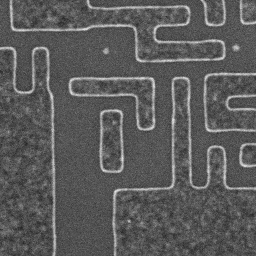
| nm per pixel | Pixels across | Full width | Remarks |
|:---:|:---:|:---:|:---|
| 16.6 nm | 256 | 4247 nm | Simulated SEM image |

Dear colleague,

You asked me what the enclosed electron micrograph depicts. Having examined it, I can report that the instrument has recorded wiring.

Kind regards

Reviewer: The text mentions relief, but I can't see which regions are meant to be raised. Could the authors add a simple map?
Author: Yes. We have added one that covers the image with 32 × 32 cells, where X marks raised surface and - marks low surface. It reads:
-XXXXXXXXXX---------------XX--XX
-XXXXXXXXXXXXXXXXXXXXXXX--XX--XX
-XXXXXXXXXXXXXXXXXXXXXXX--XX--XX
--XXXXXXXXX------XXX------------
-----------------XX-------------
-----------------XXXXXXXXXXX----
XX--XX-----------XXXXXXXXXXX----
XX--XX-----------XXXXXXX--------
XX--XX--------------------------
XX--XX--------------------XXXXXX
XX--XX---XXXXXXXXXX---XX--XXXXXX
XXXXXX---XXXXXXXXXX---XX--XXXXXX
XXXXXXX----------XX---XX--XXX---
XXXXXXX----------XX---XX--XXX---
XXXXXXX------XX--XX---XX--XXXXXX
XXXXXXX------XX--XX---XX--XXXXXX
XXXXXXX------XX-------XX--------
XXXXXXX------XX-------XX--------
XXXXXXX------XX-------XX--XX--XX
XXXXXXX------XX-------XX--XX--XX
XXXXXXX------XX-------XX--XX--XX
XXXXXXX---------------XX--XX----
XXXXXXX---------------XX--XX----
XXXXXXX--------------XXXXXXXX---
XXXXXXX-------XXXXXXXXXXXXXXXXXX
XXXXXXX-------XXXXXXXXXXXXXXXXXX
XXXXXXX-------XXXXXXXXXXXXXXXXXX
XXXXXXX-------XXXXXXXXXXXXXXXXXX
XXXXXXX-------XXXXXXXXXXXXXXXXXX
XXXXXXX-------XXXXXXXXXXXXXXXXXX
XXXXXXX-------XXXXXXXXXXXXXXXXXX
XXXXXXX-------XXXXXXXXXXXXXXXXXX